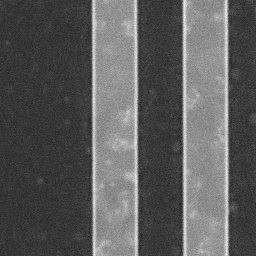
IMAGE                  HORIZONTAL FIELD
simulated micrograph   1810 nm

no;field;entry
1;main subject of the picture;one or a few lines or trenches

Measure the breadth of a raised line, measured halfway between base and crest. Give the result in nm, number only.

304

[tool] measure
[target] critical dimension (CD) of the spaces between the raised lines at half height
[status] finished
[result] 338 nm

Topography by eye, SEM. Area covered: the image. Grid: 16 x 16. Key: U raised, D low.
DDDDDDUUDDDDUUDD
DDDDDDUUDDDDUUDD
DDDDDDUUDDDDUUDD
DDDDDDUUDDDDUUDD
DDDDDDUUDDDDUUDD
DDDDDDUUUDDDUUDD
DDDDDDUUUDDDUUDD
DDDDDDUUUDDDUUDD
DDDDDDUUUDDDUUDD
DDDDDDUUUDDDUUDD
DDDDDDUUUDDDUUDD
DDDDDDUUUDDDUUDD
DDDDDDUUUDDDUUDD
DDDDDDUUUDDDUUDD
DDDDDDUUUDDDUUDD
DDDDDDUUUDDDUUDD